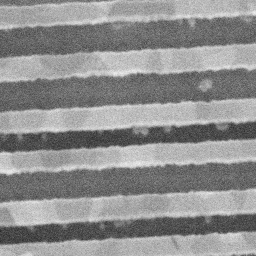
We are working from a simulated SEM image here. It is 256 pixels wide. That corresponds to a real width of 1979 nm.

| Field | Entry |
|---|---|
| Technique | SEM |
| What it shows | lines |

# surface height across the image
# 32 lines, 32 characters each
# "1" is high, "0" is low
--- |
00000000111111111111111111111111
11111111111111111111111111111111
11111111111111101000000000000000
10000000000000000000000000000000
00000000000000000000000000000000
00000000000000000000000000000001
00000000000011011111111111111111
11111111111111111111111111111111
11111111111111111111111111110001
11111111101000000000000000000000
00000000000000000000000000000000
00000000000000000000000000000000
00000000000000000000000000000011
00000000000011111111111111111111
11111111111111111111111111111111
11111111111111111111111100000000
11111000000000000000000000000000
00000000000000000000000000000000
00000000000011111111111111111111
11111111111111111111111111111111
11111111111111111111101000000000
11000000000000000000000000000000
00000000000000000000000000000000
00000000000000000000000000000000
00000000000000101111111111111111
11111111111111111111111111111111
11111111111111111111111111111111
11111111111110000000000000000000
00000000000000000000000000000000
00000000000000000000011111111111
00111111111111111111111111111111
11111111111111111111111111111111